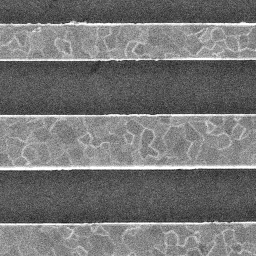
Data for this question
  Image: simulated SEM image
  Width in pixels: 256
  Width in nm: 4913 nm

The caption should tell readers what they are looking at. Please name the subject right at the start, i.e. lines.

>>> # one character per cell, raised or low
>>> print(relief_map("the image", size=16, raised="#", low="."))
................
....#....#####.#
################
################
................
................
................
################
################
################
###########.#...
................
................
................
################
################